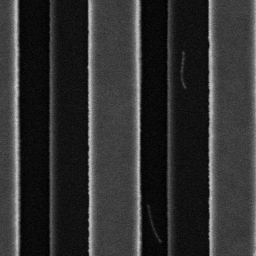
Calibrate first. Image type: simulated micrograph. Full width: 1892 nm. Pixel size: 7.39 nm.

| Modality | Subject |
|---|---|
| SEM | lines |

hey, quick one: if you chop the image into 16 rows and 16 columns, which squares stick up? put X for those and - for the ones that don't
X-----XXX----XXX
X-----XXX----XXX
X-----XXX----XXX
X-----XXX----XXX
X-----XXX----XXX
X-----XXX----XXX
X-----XXX----XXX
X-----XXX----XXX
X-----XXX----XXX
X-----XXX----XXX
X-----XXX----XXX
X-----XXX----XXX
X-----XXX----XXX
X-----XXX----XXX
X-----XXX----XXX
X-----XXX----XXX